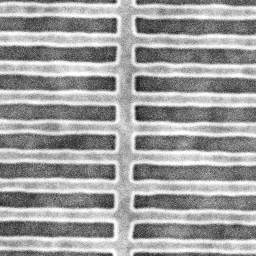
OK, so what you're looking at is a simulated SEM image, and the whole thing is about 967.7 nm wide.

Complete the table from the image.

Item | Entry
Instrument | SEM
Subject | groups of lines, slits or small figures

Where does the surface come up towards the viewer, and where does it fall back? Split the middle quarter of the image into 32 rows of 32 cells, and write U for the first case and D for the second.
UUUUUUUUUUUUUUUUUUUUUUUUUUUUUUUU
UUUUUUUUUUUUUUUUUUUUUUUUUUUUUUUU
UUUUUUUUUUUUUUUUUUUUUUUUUUUUUUUU
DDDDDDDDDDDDDUUUUDDDDDDDDDDDDDDD
DDDDDDDDDDDDDUUUUDDDDDDDDDDDDDDD
DDDDDDDDDDDDDUUUUDDDDDDDDDDDDDDD
DDDDDDDDDDDDDUUUUDDDDDDDDDDDDDDD
UUUUUUUUUUUUUUUUUUUUUDDDDDUUDDDD
UUUUUUUUUUUUUUUUUUUUUUUUUUUUUUUU
UUUUUUUUUUUUUUUUUUUUUUUUUUUUUUUU
DDDDDDDDDDDDDUUUUDDDDDDDDDDDDDDD
DDDDDDDDDDDDDUUUUDDDDDDDDDDDDDDD
DDDDDDDDDDDDDUUUUDDDDDDDDDDDDDDD
DDDDDDDDDDDDDUUUUDDDDDDDDDDDDDDD
UUUUUUUDDDDDDUUUUUDDDDDDDDDDDDDD
UUUUUUUUUUUUUUUUUUUUUUUUUUUUUUUU
UUUUUUUUUUUUUUUUUUUUUUUUUUUUUUUU
DDDDDDDDDDDDDUUUUUDDDDDDDDDDDDDD
DDDDDDDDDDDDDUUUUDDDDDDDDDDDDDDD
DDDDDDDDDDDDDUUUUDDDDDDDDDDDDDDD
DDDDDDDDDDDDDUUUUDDDDDDDDDDDDDDD
DDDDDDDDDDDDDUUUUUDDDDDDDDDDDDDD
UUUUUUUUUUUUUUUUUUUUUUUUUUUUUUUU
UUUUUUUUUUUUUUUUUUUUUUUUUUUUUUUU
UUUUUUUUUUUUUUUUUUUUUUUUUUUUUUUU
DDDDDDDDDDDDDUUUUDDDDDDDDDDDDDDD
DDDDDDDDDDDDDUUUUDDDDDDDDDDDDDDD
DDDDDDDDDDDDDUUUUDDDDDDDDDDDDDDD
DDDDDDDDDDDDDUUUUDDDDDDDDDDDDDDD
UUUUUUUUUUUUUUUUUUDUUUUUDDDDDDDD
UUUUUUUUUUUUUUUUUUUUUUUUUUUUUUUU
UUUUUUUUUUUUUUUUUUUUUUUUUUUUUUUU